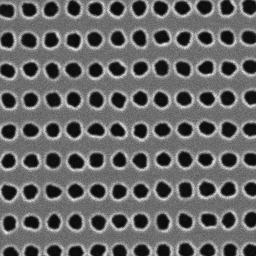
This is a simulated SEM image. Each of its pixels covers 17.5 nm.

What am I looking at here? a regular array of holes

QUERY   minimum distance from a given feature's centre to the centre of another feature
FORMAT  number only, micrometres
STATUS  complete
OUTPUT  0.38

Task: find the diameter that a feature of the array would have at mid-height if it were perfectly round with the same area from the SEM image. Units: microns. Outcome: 0.271